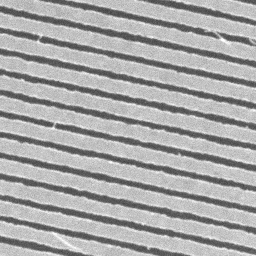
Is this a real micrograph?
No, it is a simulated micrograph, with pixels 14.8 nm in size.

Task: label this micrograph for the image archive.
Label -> parallel lines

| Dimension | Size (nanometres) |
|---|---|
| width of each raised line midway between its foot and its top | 190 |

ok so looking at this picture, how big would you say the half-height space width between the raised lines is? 108 nm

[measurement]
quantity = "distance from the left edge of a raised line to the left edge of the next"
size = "301 nm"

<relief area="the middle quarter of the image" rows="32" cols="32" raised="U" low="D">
DDDDDDUUUUUUUUUUUUUUUDDDDDDDDDDU
UDDDDDDDDDDUUUUUUUUUUUUUUUDDDDDD
UUUUUUDDDDDDDDDDUUUUUUUUUUUUUUDD
UUUUUUUUUUUDDDDDDDDDUUUUUUUUUUUU
UUUUUUUUUUUUUUUDDDDDDDDDUUUUUUUU
DDDDDUUUUUUUUUUUUUUUDDDDDDDDDUUU
DDDDDDDDDUUUUUUUUUUUUUUUUDDDDDDD
UUUUUDDDDDDDDDUUUUUUUUUUUUUUUDDD
UUUUUUUUUDDDDDDDDDDDUUUUUUUUUUUU
UUUUUUUUUUUUUUDDDDDDDDDDDUUUUUUU
DDDDUUUUUUUUUUUUUUUDDDDDDDDDUUUU
DDDDDDDDUUUUUUUUUUUUUUUUDDDDDDDD
UUUUDDDDDDDDDUUUUUUUUUUUUUUUUDDD
UUUUUUUUUDDDDDDDDUUUUUUUUUUUUUUU
UUUUUUUUUUUUUUDDDDDDDDUUUUUUUUUU
DDDDUUUUUUUUUUUUUUUDDDDDDDDDUUUU
DDDDDDDDUUUUUUUUUUUUUUDDDDDDDDDU
UUUDDDDDDDDDUUUUUUUUUUUUUUUUDDDD
UUUUUUUUDDDDDDDDDUUUUUUUUUUUUUUD
UUUUUUUUUUUUDDDDDDDDDDUUUUUUUUUU
DDUUUUUUUUUUUUUUUDDDDDDDDDUUUUUU
DDDDDDDUUUUUUUUUUUUUUUDDDDDDDDDU
UUDDDDDDDDDDUUUUUUUUUUUUUUDDDDDD
UUUUUUDDDDDDDDDDUUUUUUUUUUUUUUUD
UUUUUUUUUUUDDDDDDDDDUUUUUUUUUUUU
DUUUUUUUUUUUUUUUUDDDDDDDDDUUUUUU
DDDDDDUUUUUUUUUUUUUUUDDDDDDDDDUU
UDDDDDDDDDDUUUUUUUUUUUUUUDDDDDDD
UUUUUUDDDDDDDDDUUUUUUUUUUUUUUUDD
UUUUUUUUUUDDDDDDDDDDUUUUUUUUUUUU
DUUUUUUUUUUUUUUDDDDDDDDDUUUUUUUU
DDDDDDUUUUUUUUUUUUUUDDDDDDDDUUUU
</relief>